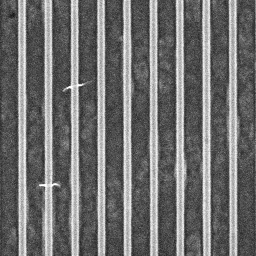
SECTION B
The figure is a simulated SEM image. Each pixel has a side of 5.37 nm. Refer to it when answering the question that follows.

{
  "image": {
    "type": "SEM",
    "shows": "parallel lines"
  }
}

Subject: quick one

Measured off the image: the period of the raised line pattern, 141 nm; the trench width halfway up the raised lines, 107 nanometers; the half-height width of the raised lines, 0.0356 micrometres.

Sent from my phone